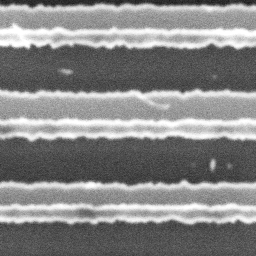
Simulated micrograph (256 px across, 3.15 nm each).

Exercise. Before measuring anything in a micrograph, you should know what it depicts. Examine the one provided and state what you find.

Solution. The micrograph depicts lines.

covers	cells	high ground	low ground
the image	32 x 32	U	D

DDDDDDDDDDDDDDDDDDDDDDDDDDDDDDDD
UUUUUUUUUUUUUUUUUUUUUUUUUUUUUUUU
UUUUUUUUUUUUUUUUUUUUUUUUUUUUUUUU
UUUUUUUUUUUUUUUUUUUUUUUUUUUUUUUU
UUUUUUUUUUUUUUUUUUUUUUUUUUUUUUUU
UUUUUDUUDDDUUUUUUUUUUUUUUUDUDUUU
DDDDDDDDDDDDDDDDDDDDDDDDDDDDDDDD
DDDDDDDDDDDDDDDDDDDDDDDDDDDDDDDD
DDDDDDDDDDDDDDDDDDDDDDDDDDDDDDDD
DDDDDDDDDDDDDDDDDDDDDDDDDDDDDDDD
DDDDDDDDDDDDDDDDDDDDDDDDDDDDDDDD
UDDDDDDDDDDDDDDDUDDDDDDDUDDDDDDD
UUUUUUUUUUUUUUUUUUUUUUUUUUUUUUUU
UUUUUUUUUUUUUUUUUUUUUUUUUUUUUUUU
UUUUUUUUUUUUUUUUUUUUUUUUUUUUUUUU
UUUUUUUUUUUUUUUUUUUUUUUUUUUUUUUU
UUUUUUUUUUUUUUUUUUUUUUUUUUUUUUUU
DDDDDDDDDDDDDDDDDDDDDDDDDDDDDDDD
DDDDDDDDDDDDDDDDDDDDDDDDDDDDDDDD
DDDDDDDDDDDDDDDDDDDDDDDDDDDDDDDD
DDDDDDDDDDDDDDDDDDDDDDDDDDDDDDDD
DDDDDDDDDDDDDDDDDDDDDDDDDDDDDDDD
DDDDDDDDDDDDDDDDDDDDDDDDDDDDDDDD
UUUUUUUUUUUUUUUUUUUUUUUUUUUUUUUU
UUUUUUUUUUUUUUUUUUUUUUUUUUUUUUUU
UUUUUUUUUUUUUUUUUUUUUUUUUUUUUUUU
UUUUUUUUUUUUUUUUUUUUUUUUUUUUUUUU
UUUDDUDDUUUUUUDDUUUUDDUUUUUUUDUU
DDDDDDDDDDDDDDDDDDDDDDDDDDDDDDDD
DDDDDDDDDDDDDDDDDDDDDDDDDDDDDDDD
DDDDDDDDDDDDDDDDDDDDDDDDDDDDDDDD
DDDDDDDDDDDDDDDDDDDDDDDDDDDDDDDD